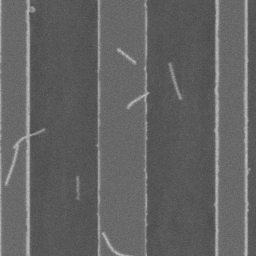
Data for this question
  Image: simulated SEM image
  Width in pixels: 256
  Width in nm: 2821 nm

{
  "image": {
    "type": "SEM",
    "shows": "lines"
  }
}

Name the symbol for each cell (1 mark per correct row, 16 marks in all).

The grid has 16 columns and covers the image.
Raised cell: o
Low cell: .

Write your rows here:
oo....ooo....oo.
oo....ooo....oo.
oo....ooo....oo.
oo....ooo....oo.
oo....ooo....oo.
oo....ooo....oo.
oo....ooo....oo.
oo....ooo....oo.
oo....ooo....oo.
oo....ooo....oo.
oo....ooo....oo.
oo....ooo....oo.
oo....ooo....oo.
oo....ooo....oo.
oo....ooo....oo.
oo....ooo....oo.